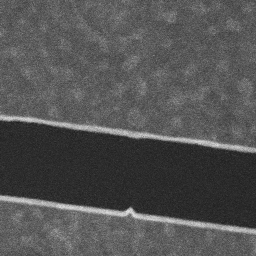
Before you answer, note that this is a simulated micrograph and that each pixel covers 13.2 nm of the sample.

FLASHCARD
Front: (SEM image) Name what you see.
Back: one or a few lines or trenches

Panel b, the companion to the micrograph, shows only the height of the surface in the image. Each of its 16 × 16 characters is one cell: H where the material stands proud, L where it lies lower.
HHHHHHHHHHHHHHHH
HHHHHHHHHHHHHHHH
HHHHHHHHHHHHHHHH
HHHHHHHHHHHHHHHH
HHHHHHHHHHHHHHHH
HHHHHHHHHHHHHHHH
HHHHHHHHHHHHHHHH
LLHHHHHHHHHHHHHH
LLLLLLLLLLHHHHHH
LLLLLLLLLLLLLLLL
LLLLLLLLLLLLLLLL
LLLLLLLLLLLLLLLL
HLLLLLLLLLLLLLLL
HHHHHHHHHLLLLLLL
HHHHHHHHHHHHHHHH
HHHHHHHHHHHHHHHH